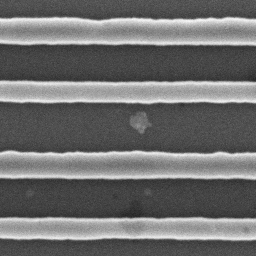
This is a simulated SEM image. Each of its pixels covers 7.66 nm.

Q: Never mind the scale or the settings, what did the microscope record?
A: lines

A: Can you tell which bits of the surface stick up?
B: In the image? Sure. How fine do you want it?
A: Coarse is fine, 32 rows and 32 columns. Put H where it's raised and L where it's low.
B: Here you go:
LLLLLLLLLLLLLLLLLLLLLLLLLLLLLLLL
LLLLLLLLLLLLLLLLLLLLLLLLLLLLLLLL
HHHHHHHHHHHLLLHHHHHLLLLLLHHHHHHL
HHHHHHHHHHHHHHHHHHHHHHHHHHHHHHHH
HHHHHHHHHHHHHHHHHHHHHHHHHHHHHHHH
LLLLLLLLLLLLLLLLLLLLLLLLLLLLLLLL
LLLLLLLLLLLLLLLLLLLLLLLLLLLLLLLL
LLLLLLLLLLLLLLLLLLLLLLLLLLLLLLLL
LLLLLLLLLLLLLLLLLLLLLLLLLLLLLLLL
LLLLLLLLLLLLLLLLLLLLLLLLLLLLLLLL
HHHHHHHHHHHHHHLHHHHHHHHHHHHHHHHH
HHHHHHHHHHHHHHHHHHHHHHHHHHHHHHHH
HHHHHHHHHHHHHHHHHHHHHHHHHHHHHHHH
LLLLLLLLLLLLLLLLLLLLLLLLLLLLLLLL
LLLLLLLLLLLLLLLLLLLLLLLLLLLLLLLL
LLLLLLLLLLLLLLLLLLLLLLLLLLLLLLLL
LLLLLLLLLLLLLLLLLLLLLLLLLLLLLLLL
LLLLLLLLLLLLLLLLLLLLLLLLLLLLLLLL
LLLLLLLLLLLLLLLLLLLLLLLLLLLLLLLL
HHHHHHHHHHHHHHHHHHHHHHHHHHHHHHHH
HHHHHHHHHHHHHHHHHHHHHHHHHHHHHHHH
HHHHHHHHHHHHHHHHHHHHHHHHHHHHHHHH
LLLLLLLLLLLLLLLLLLLLLLLLLLLLLLLL
LLLLLLLLLLLLLLLLLLLLLLLLLLLLLLLL
LLLLLLLLLLLLLLLLLLLLLLLLLLLLLLLL
LLLLLLLLLLLLLLLLLLLLLLLLLLLLLLLL
LLLLLLLLLLLLLLLLLLLLLLLLLLLLLLLL
HHHHHHHHHHHHHHHHHHHHHHHHHHHHHHHH
HHHHHHHHHHHHHHHHHHHHHHHHHHHHHHHH
HHHHHHHHHHHHHHHHHHHHHHHHHHHHHHHH
LLLLLLLLLLLLLLLLLLLLLLLLLLLLLLLL
LLLLLLLLLLLLLLLLLLLLLLLLLLLLLLLL